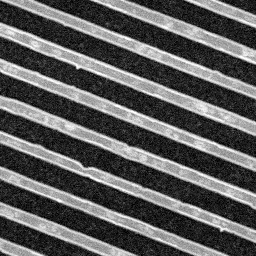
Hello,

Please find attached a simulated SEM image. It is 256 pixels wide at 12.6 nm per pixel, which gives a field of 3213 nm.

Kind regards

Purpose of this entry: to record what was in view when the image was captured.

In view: parallel lines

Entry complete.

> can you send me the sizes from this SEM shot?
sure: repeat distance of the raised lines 419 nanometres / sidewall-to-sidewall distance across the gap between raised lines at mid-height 0.295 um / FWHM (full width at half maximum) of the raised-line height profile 0.126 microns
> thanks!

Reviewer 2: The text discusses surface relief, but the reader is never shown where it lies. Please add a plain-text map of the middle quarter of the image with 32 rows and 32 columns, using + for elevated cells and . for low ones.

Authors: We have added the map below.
...++++++++................+++++
.......++++++.................++
.........+++++++................
............++++++..............
..............+++++++...........
.................+++++++........
++++...............+++++++......
++++++...............++++++++...
.++++++++................++++++.
....+++++++................+++++
.......+++++++................++
.........+++++++................
............+++++++.............
..............+++++++...........
+................+++++++........
+++................+++++++......
++++++................+++++++...
.+++++++.................++++++.
....+++++++................+++++
.......++++++.................++
.........+++++++................
............+++++++.............
..............++++++++..........
................++++++++........
+++................++++++++.....
++++..................+++++++...
..++++++.................+++++++
.....++++++................+++++
.......++++++.................++
..........++++++................
............++++++..............
...............++++++...........